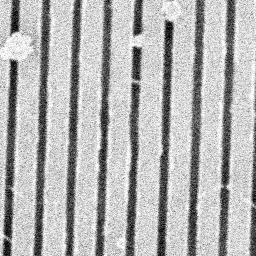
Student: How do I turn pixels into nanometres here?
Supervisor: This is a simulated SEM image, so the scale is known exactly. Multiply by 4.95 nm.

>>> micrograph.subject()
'parallel lines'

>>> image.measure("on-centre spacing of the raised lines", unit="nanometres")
152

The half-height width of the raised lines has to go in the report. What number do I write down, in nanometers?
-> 110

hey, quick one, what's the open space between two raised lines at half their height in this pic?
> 42 nanometres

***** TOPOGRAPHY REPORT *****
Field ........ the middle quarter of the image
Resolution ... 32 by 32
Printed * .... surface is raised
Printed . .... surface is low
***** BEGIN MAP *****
**..*****...*****..******..*****
*...*****...*****..******..*****
*...*****...*****..******..*****
*...*****..******..******..*****
*...*****..******.*******..*****
*...*****..******..*****...*****
*...*****..******..*****...*****
*...*****..******..*****...*****
*...*****..******..******..*****
*...*****..******..*****...*****
*...*****..******..*****...*****
*...*****..******..*****...*****
*..******..*****...*****...*****
*...*****..*****...*****...*****
*..******..*****...*****...*****
*..******..*****...*****...*****
*..******..*****...*****..******
*..******..*****...*****..******
*..******..*****...*****...*****
*..******..*****...*****...*****
*..******..*****...*****...*****
*..******..*****...*****..******
*..*****...******..*****..******
*..*****...******..*****..******
*..******..******.******..******
*..******..*****..******..*****.
*..******..*****..******..*****.
*..*****...*****..******..*****.
*..*****...*****..******..*****.
*..*****...*****..******..*****.
...*****...*****..******..*****.
...*****...*****..******..*****.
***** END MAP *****